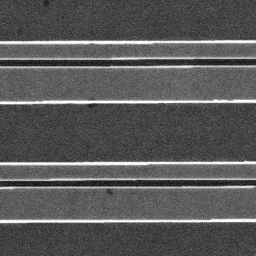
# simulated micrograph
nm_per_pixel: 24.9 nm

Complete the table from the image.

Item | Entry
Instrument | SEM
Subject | lines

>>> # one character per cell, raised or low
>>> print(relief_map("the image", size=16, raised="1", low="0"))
0000000000000000
0000000000000000
0000000000000000
1111111111111111
1111111111111111
1111111111111111
0000000000000000
0000000000000000
0000000000000000
0000000000000000
1111111111111111
1111111111111111
1111111111111111
1111111111111111
0000000000000000
0000000000000000